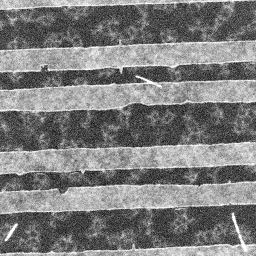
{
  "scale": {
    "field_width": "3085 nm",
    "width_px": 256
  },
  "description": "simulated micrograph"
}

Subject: parallel lines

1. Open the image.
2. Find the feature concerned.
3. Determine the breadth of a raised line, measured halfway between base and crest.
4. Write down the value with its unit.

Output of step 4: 256 nm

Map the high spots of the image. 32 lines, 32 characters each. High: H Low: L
HHHHHHHHHHHHHHHHHLLLLLLLLLLLLLLL
LLLLLLLLLLLLLLLLLLLLLLLLLLLLLLLL
LLLLLLLLLLLLLLLLLLLLLLLLLLLLLLLL
LLLLLLLLLLLLLLLLLLLLLLLLLLLLLLLL
LLLLLLLLLLLLLLLLLLLLLLLLLLLLLLLL
LLLLLLLLLLLLLLLLLLLLHHHHHHHHHHHH
HHHHHHHHHHHHHHHHHHHHHHHHHHHHHHHH
HHHHHHHHHHHHHHHHHHHHHHHHHHHHHHHH
HHHHHLHHHHHHHLLHLLLLLLLLLLLLLLLH
LLLLLLLLLLLLLLLLLLLLLHLLLLLLLLLL
LLLLLLLLLLLLLLLLHHHHHHHHHHHHHHHH
HHHHHHHHHHHHHHHHHHHHHHHHHHHHHHHH
HHHHHHHHHHHHHHHHHHHHHHHHHHHHHHHH
HHHHHHHHHHHHHHHLLLLLLLLLLLLLLLLL
LLLLLLLLLLLLLLLLLLLLLLLLLLLLLLLL
LLLLLLLLLLLLLLLLLLLLLLLLLLLLLLLL
LLLLLLLLLLLLLLLLLLLLLLLLLLLLLLLL
LLLLLLLLLLLLLLLLLLLLLLLLLLLLLLLL
LLLLLLLLHLLLLLHHHHHHHHHHHHHHHHHH
HHHHHHHHHHHHHHHHHHHHHHHHHHHHHHHH
HHHHHHHHHHHHHHHHHHHHHHHHHHHHHHHH
HHHHHHLLHHLLLLLLLLLLLLLLLLLLLLLL
LLLLLLLLLLLLLLLLLLLLLLLLLLLLLLLL
LLLLLLLLLHHHHHHHHHHHHHHHHHHHHHHH
HHHHHHHHHHHHHHHHHHHHHHHHHHHHHHHH
HHHHHHHHHHHHHHHHHHHHHHHHHHHHHLLL
HHLLLLLLLLLLLLLLLLLLLLHLLLLLLLLL
LLLLLLLLLLLLLLLLLLLLLLLLLLLLLLLL
LLLLLLLLLLLLLLLLLLLLLLLLLLLLLLLL
LLLLLLLLLLLLLLLLLLLLLLLLLLLLLLLL
LLLLLLLLLLLLLLLLLLLLLLLLLLLLLLLL
LLLLLLLLLLHHHHHHHHHHHHHHHHHHHHHH